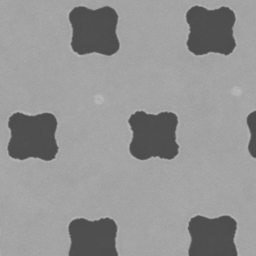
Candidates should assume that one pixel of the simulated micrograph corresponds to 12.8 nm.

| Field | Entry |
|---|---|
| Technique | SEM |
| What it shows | holes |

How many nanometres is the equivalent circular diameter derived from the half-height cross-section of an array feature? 663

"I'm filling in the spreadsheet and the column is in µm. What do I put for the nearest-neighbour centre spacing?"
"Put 1.51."